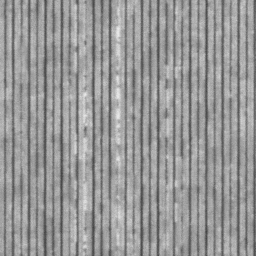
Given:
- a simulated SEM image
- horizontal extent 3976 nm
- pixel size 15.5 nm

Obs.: parallel lines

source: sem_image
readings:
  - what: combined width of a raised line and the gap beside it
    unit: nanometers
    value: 125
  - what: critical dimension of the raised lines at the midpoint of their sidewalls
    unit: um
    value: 0.0932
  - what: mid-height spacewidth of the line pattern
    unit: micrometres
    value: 0.0388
